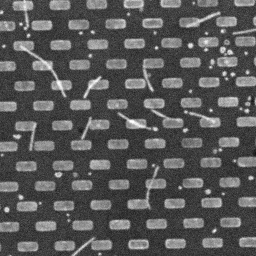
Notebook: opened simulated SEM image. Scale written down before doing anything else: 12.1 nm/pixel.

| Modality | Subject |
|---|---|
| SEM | groups of lines, slits or small figures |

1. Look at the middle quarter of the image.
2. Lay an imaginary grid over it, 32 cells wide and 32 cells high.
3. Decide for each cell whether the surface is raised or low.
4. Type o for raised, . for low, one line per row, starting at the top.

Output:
..oooo.....oooo.....ooooo.....oo
................................
................................
................................
oo....ooooo.....oooo.....oooo...
oo....ooooo.....oooo.....oooo...
................................
................................
................................
..oooo.....ooooo....ooooo.....oo
..oooo.....ooooo....ooooo.....oo
................................
................................
................................
oo....ooooo.....oooo.....ooooo..
oo....ooooo.....ooooo....oooo...
................................
................................
................................
..oooo.....ooooo....ooooo.....oo
..ooooo....ooooo....ooooo.....oo
................................
................................
................................
oo.....oooo.....ooooo....ooooo..
oo.....oooo.....ooooo....ooooo..
................................
................................
................................
..ooooo.....oooo.....oooo.....oo
..ooooo....ooooo.....oooo.....oo
................................